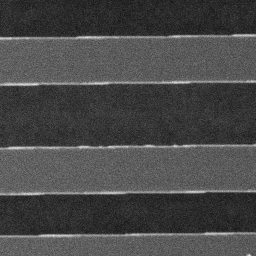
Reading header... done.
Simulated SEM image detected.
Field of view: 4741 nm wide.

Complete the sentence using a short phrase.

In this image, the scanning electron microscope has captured lines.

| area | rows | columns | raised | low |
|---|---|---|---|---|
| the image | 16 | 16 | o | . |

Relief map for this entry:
................
................
oooooooooooooooo
oooooooooooooooo
oooooooooooooooo
................
................
................
................
oooooooooooooooo
oooooooooooooooo
oooooooooooooooo
................
................
................
oooooooooooooooo